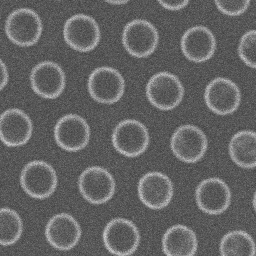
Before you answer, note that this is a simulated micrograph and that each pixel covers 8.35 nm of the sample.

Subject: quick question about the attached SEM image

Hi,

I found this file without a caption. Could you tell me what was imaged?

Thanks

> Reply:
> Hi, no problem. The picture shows a regular array of raised bodies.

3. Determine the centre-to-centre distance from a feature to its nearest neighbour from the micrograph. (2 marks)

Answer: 481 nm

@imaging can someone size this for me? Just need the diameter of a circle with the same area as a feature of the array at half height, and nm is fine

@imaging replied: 287